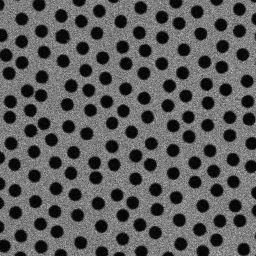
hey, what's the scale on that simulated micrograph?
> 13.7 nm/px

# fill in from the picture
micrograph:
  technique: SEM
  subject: a regular array of holes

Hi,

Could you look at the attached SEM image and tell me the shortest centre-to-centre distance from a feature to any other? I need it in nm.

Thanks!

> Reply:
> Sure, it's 266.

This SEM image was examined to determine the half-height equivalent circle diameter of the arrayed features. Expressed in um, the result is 0.175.